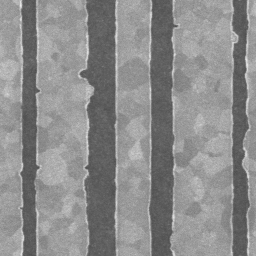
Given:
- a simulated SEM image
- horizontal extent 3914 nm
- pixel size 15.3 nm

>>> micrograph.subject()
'one or a few lines or trenches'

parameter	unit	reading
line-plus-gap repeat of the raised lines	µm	1.08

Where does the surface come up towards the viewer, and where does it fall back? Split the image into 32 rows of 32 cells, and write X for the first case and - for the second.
XXX--XXXXXX----XXXX---XXXXXXX--X
XXX--XXXXXX----XXXX---XXXXXXX--X
XXX--XXXXXX----XXXX---XXXXXXX--X
XXX--XXXXXX----XXXX---XXXXXXX--X
XXX--XXXXXX----XXXX---XXXXXXXX-X
XXX--XXXXXX----XXXX---XXXXXXX--X
XXX--XXXXXX----XXXX---XXXXXXX--X
XXX--XXXXXX----XXXX---XXXXXXX--X
XXX--XXXXXX----XXXX---XXXXXXX--X
XXX--XXXXX-----XXXX---XXXXXXX--X
XXX--XXXXXX----XXXX---XXXXXXX--X
XXX--XXXXXXX---XXXX---XXXXXXX--X
XXX--XXXXXX----XXXX---XXXXXXX--X
XXX--XXXXXX----XXXX---XXXXXXX--X
XXX--XXXXXX----XXXX---XXXXXXX--X
XXX--XXXXXX----XXXX---XXXXXXX--X
XXX--XXXXXX----XXXX---XXXXXXX--X
XXX--XXXXXX----XXXX---XXXXXXX--X
XXX--XXXXXX----XXXX---XXXXXXX--X
XXX--XXXXXX----XXXX---XXXXXXX--X
XXX--XXXXXX----XXXX---XXXXXXX-XX
XXX--XXXXXX----XXXX---XXXXXXX--X
XXX-XXXXXX-----XXXX---XXXXXXX--X
XXX-XXXXXX-----XXXX---XXXXXXX--X
XXX--XXXXXX----XXXX---XXXXXXX--X
XXX--XXXXXX----XXXX---XXXXXXX--X
XXX--XXXXXX----XXXX---XXXXXXX--X
XXX--XXXXXX---XXXXX---XXXXXXX--X
XXX--XXXXXX----XXXX---XXXXXXX--X
XXX--XXXXXX----XXXX--XXXXXXXX--X
XXX--XXXXXX----XXXX--XXXXXXXX--X
XXX--XXXXXX----XXXX---XXXXXXX--X